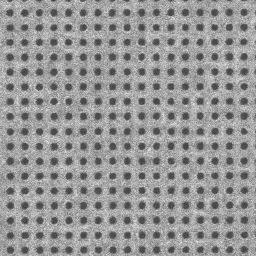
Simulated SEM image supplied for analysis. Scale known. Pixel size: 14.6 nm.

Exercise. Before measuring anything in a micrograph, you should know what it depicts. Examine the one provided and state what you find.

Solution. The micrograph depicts a regular array of holes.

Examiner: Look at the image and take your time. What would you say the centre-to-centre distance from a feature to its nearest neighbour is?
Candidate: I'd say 211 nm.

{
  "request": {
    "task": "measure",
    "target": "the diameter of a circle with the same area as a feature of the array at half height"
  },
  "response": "0.114 micrometres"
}